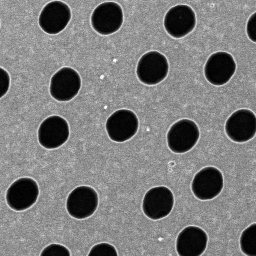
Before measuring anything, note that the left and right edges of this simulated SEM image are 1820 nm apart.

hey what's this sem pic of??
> a regular array of holes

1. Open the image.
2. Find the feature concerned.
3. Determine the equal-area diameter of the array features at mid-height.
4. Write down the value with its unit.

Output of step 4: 0.217 microns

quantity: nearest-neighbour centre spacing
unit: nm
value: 380